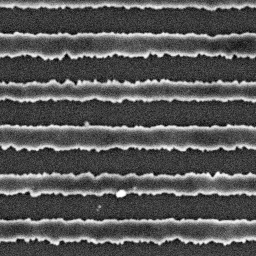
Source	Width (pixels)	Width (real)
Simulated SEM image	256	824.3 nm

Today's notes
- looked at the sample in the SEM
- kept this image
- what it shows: lines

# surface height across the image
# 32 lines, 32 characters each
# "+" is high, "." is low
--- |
++++++++++++++++++++++++++++++++
................................
................................
................................
++++++++++++++++++++++++++.+++++
++++++++++++++++++++++++++++++++
++++++++++++++++++++++++++++++++
................................
................................
................................
++++++++++++++++++++++++++++++++
++++++++++++++++++++++++++++++++
.+++++..+++.++++++++.++++++++.++
................................
................................
................................
++++++++++++++++++++++++++++++++
++++++++++++++++++++++++++++++++
+.+++.++++++++.+.+++++++++++++.+
................................
................................
................................
++++++++++++++++++++++++++++++++
++++++++++++++++++++++++++++++++
................................
................................
................................
...+.+++.+......+...++..++......
++++++++++++++++++++++++++++++++
++++++++++++++++++++++++++++++++
................................
................................